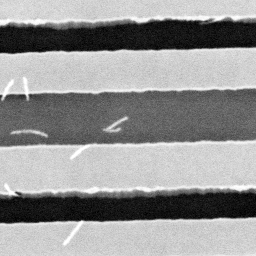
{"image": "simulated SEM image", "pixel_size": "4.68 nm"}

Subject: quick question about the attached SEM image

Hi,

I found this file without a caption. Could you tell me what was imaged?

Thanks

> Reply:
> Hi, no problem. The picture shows lines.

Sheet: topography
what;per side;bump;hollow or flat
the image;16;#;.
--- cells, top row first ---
################
..##............
................
################
################
###############.
................
................
................
################
################
################
................
................
################
################